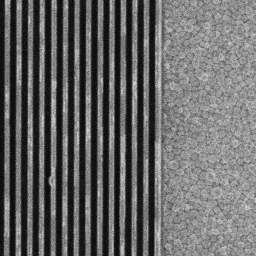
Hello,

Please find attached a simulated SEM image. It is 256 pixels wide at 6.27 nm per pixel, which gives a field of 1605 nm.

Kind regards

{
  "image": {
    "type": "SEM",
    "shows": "parallel lines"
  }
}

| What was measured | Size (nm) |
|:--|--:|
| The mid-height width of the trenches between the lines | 36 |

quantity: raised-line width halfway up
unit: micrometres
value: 0.036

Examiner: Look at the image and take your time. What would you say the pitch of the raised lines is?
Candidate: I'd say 72.7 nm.